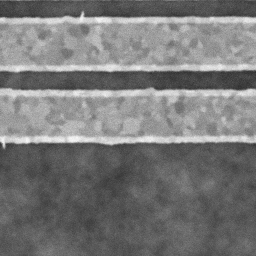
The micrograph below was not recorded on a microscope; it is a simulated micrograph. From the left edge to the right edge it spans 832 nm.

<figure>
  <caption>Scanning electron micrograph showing one or a few lines or trenches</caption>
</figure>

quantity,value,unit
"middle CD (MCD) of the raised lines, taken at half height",0.157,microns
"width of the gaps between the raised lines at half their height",78.4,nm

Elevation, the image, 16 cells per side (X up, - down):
----------------
XXXXXXXXXXXXXXXX
XXXXXXXXXXXXXXXX
XXXXXXXXXXXXXXXX
----------------
----------------
XXXXXXXXXXXXXXXX
XXXXXXXXXXXXXXXX
XXXXXXXXXXXXXXXX
----------------
----------------
----------------
----------------
----------------
----------------
----------------